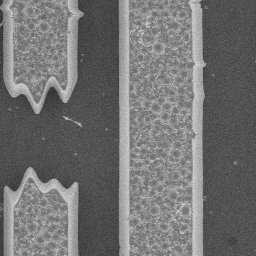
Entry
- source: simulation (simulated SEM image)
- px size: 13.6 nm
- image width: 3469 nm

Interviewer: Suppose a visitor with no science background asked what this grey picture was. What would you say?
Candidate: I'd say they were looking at one or a few lines or trenches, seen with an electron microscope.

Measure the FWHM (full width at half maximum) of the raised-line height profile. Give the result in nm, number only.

987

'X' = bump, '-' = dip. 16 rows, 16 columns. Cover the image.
XXXXX---XXXX----
XXXXX---XXXX----
-XXXX---XXXX----
-XXXX---XXXX----
-XXXX---XXXX----
-XX-----XXXX----
--------XXXX----
--------XXXX----
--------XXXX----
--------XXXX----
--------XXXX----
-XX-----XXXX----
-XXX----XXXX----
-XXXX---XXXX----
-XXXX---XXXX----
-XXXX---XXXX----